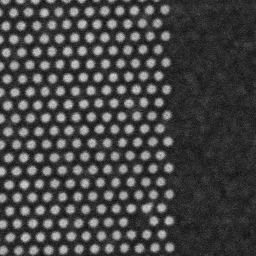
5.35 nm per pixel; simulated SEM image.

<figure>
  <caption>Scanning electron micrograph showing a regular array of raised bodies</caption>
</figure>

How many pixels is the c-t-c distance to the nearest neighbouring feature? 14.8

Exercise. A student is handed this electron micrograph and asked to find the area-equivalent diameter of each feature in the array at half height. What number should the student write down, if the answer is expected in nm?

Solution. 43.5